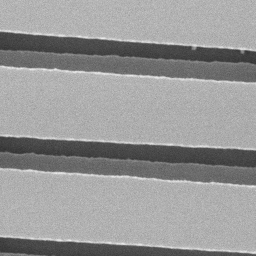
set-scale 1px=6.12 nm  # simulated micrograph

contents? lines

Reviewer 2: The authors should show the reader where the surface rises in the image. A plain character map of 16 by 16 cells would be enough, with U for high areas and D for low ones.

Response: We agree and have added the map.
UUUUUUUUUUUUUUUU
UUUUUUUUUUUUUUUU
DDDDDDDUUUUUUUUU
DDDDDDDDDDDDDDDD
UUUUUUDDDDDDDDDD
UUUUUUUUUUUUUUUU
UUUUUUUUUUUUUUUU
UUUUUUUUUUUUUUUU
UUUUUUUUUUUUUUUU
DDDDDDDDDDDDDDDD
DDDDDDDDDDDDDDDD
UUUUUUUUUUUUUUDD
UUUUUUUUUUUUUUUU
UUUUUUUUUUUUUUUU
UUUUUUUUUUUUUUUU
DDDDDDDDDDDUUUUU